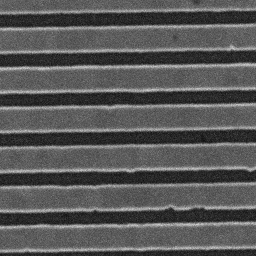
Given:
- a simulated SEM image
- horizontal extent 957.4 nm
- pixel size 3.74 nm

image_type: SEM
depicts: parallel lines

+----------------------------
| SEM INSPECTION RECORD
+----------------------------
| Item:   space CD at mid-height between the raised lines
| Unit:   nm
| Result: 56.1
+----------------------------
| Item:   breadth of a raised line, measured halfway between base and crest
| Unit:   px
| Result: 24.5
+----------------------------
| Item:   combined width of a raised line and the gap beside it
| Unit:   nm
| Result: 148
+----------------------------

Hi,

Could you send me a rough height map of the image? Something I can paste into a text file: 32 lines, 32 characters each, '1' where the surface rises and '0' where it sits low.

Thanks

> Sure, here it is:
11111111111111111111111111111111
11111111111000000000000000000000
00000000000000000000000000000000
00000000001111111111111111111111
11111111111111111111111111111111
11111111111111111111111111111111
11111110000000000000000000000000
00000000000000000000000000000000
00000001111111111111111111111111
11111111111111111111111111111111
11111111111111111111111111111111
11100000000000000000000000000000
00000000000000000000000000000000
00011111111111111111111111111111
11111111111111111111111111111111
11111111111111111111111111111111
00000000000000000000000000000000
00000000000000000000000000000000
11111111111111111111111111111111
11111111111111111111111111111111
11111111111111111111111111111111
10000000000000000000000000000000
00000000000000000000000000000000
11111111111111111111111111111111
11111111111111111111111111111111
11111111111111111111111111111111
00000000000000000000000000000000
00000000000000000000000000000000
11111111111111111111111111111111
11111111111111111111111111111111
11111111111111111111111111111111
00000000000000000000000000000000